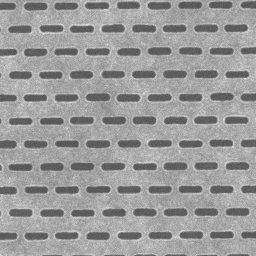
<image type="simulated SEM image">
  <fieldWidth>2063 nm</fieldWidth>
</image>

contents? a regular array of holes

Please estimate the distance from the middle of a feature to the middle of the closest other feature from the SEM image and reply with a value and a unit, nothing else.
219 nanometres